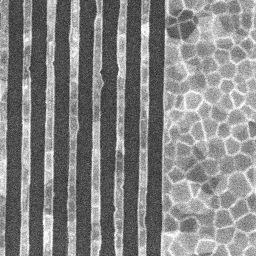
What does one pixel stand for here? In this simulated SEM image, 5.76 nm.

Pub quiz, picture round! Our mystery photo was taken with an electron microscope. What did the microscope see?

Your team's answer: parallel lines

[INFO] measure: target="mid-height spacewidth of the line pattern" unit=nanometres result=94.3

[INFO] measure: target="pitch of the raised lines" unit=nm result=136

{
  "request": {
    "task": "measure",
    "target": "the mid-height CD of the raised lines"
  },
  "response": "39.6 nm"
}